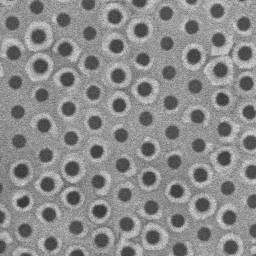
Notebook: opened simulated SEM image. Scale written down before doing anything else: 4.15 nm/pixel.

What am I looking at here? a regular array of holes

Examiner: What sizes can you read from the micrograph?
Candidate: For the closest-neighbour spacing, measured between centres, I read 29.1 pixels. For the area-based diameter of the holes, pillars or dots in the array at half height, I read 57.7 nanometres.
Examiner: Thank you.